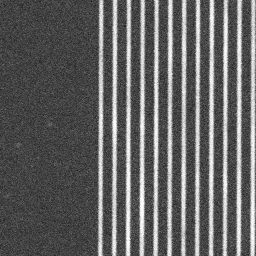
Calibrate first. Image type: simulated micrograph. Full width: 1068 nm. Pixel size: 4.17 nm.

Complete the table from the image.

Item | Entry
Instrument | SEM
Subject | parallel lines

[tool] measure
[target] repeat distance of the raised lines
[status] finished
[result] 57.7 nm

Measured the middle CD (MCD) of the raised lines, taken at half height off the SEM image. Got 14.6 nanometers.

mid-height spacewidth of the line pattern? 43.3 nm